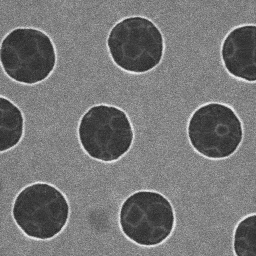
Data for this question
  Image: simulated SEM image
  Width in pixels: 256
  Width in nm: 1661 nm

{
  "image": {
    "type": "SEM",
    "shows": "holes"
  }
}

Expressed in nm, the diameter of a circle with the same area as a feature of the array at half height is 356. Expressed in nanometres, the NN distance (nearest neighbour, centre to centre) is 616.